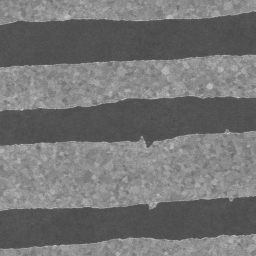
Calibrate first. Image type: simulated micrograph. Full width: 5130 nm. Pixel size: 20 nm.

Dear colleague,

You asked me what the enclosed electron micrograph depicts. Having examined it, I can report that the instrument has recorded one or a few lines or trenches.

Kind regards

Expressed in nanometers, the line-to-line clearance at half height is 780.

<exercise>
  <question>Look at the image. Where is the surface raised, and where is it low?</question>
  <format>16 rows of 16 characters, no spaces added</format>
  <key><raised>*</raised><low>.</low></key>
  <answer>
****************
................
................
................
****************
****************
******..........
................
............****
****************
****************
****************
**********......
................
................
..**************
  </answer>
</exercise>